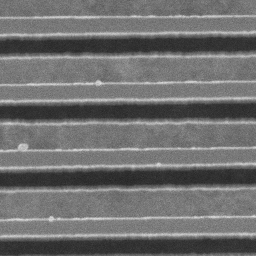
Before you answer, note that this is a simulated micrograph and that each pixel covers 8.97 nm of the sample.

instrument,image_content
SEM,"lines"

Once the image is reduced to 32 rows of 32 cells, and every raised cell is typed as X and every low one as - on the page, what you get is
XXXXXXXXXXXXXXXXXXXXXXXXXXXXXXXX
XXXXXXXXXXXXXXXXXXXXXXXXXXXXXXXX
XXXXXXXXXXXXXXXXXXXXXXXXXXXXXXXX
XXXXXXXXXXXXXXXXXXXXXXXXXXXXXXXX
XXXXXXXX------------------------
--------------------------------
--------------------------------
XXXXXXXXXXXXXXXXXXXXXXXXXXXXXXXX
XXXXXXXXXXXXXXXXXXXXXXXXXXXXXXXX
XXXXXXXXXXXXXXXXXXXXXXXXXXXXXXXX
XXXXXXXXXXXXXXXXXXXXXXXXXXXXXXXX
XXXXXXXXXXXXXXXXXXXXXXXXXXXXXXXX
XXXXXXXXXXXXXXXXXXXXXXXXXXXXXXX-
--------------------------------
--------------------------------
XXXXXXXXXXXXXXXXXXXXXXXXXXXXXXXX
XXXXXXXXXXXXXXXXXXXXXXXXXXXXXXXX
XXXXXXXXXXXXXXXXXXXXXXXXXXXXXXXX
XXXXXXXXXXXXXXXXXXXXXXXXXXXXXXXX
XXXXXXXXXXXXXXXXXXXXXXXXXXXXXXXX
XXXXXXXXXXXXXXXXXXXXXXXXXXXXXXXX
--------------------------------
--------------------------------
------------------------XX-XXXXX
XXXXXXXXXXXXXXXXXXXXXXXXXXXXXXXX
XXXXXXXXXXXXXXXXXXXXXXXXXXXXXXXX
XXXXXXXXXXXXXXXXXXXXXXXXXXXXXXXX
XXXXXXXXXXXXXXXXXXXXXXXXXXXXXXXX
XXXXXXXXXXXXXXXXXXXXXXXXXXXXXXXX
XXXXXXXXXXXXXXXXXXXXXXXXX-------
--------------------------------
--------------------------------